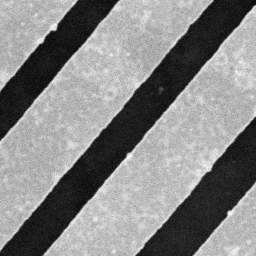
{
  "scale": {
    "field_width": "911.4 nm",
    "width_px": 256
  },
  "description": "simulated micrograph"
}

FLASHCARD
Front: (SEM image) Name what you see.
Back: lines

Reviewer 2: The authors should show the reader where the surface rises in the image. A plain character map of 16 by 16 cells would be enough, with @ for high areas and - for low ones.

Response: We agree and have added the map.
@@@@---@@@@@@---
@@@@--@@@@@@---@
@@@--@@@@@@---@@
@@---@@@@@---@@@
@---@@@@@@--@@@@
---@@@@@@---@@@@
--@@@@@@---@@@@@
-@@@@@@---@@@@@@
@@@@@@---@@@@@@-
@@@@@---@@@@@@--
@@@@---@@@@@@---
@@@---@@@@@@----
@@@---@@@@@----@
@@---@@@@@@---@@
@---@@@@@@---@@@
---@@@@@@----@@@